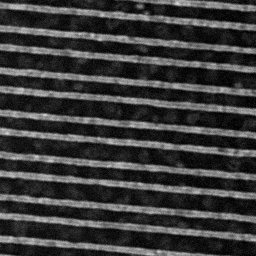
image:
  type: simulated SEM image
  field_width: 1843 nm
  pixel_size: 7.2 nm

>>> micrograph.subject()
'parallel lines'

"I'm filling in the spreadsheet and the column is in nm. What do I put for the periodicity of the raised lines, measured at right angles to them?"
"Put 151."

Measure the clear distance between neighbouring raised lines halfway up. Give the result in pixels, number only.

15.1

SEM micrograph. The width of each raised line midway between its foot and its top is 36.7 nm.